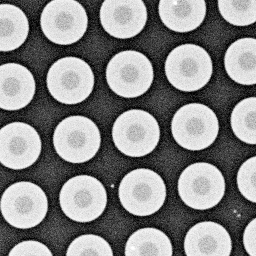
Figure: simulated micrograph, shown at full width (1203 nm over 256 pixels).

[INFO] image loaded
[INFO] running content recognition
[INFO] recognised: an array of small figures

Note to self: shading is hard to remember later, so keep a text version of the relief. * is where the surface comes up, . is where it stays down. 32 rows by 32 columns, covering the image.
......****...*****..******.*****
***..******..*****..******..****
***..******..*****..*****...****
***..******..*****...***........
***...****....***...............
***..........................***
...............**....*****..****
........**....****...*****..****
***...*****..******..*****..****
****..******.******..*****...***
****..******..*****...****......
****..*****...****..............
****...***.....................*
***....................***...***
...............****...*****..***
.**....*****..******..*****..***
****...*****..******..*****..***
*****..*****..******..*****...**
*****..*****...****....**.......
*****...****....................
****....................**....**
................***....****...**
.........***...*****..******..**
.****...*****..******.******..**
******..*****..******..*****...*
******..*****..*****...****.....
******..*****...***.............
.****....**.....................
........................****...*
..........**....*****..******..*
..***....****...*****..******..*
.*****..******..*****..******..*